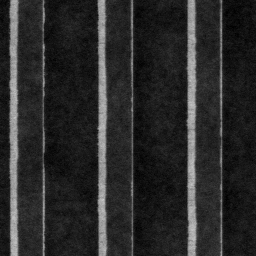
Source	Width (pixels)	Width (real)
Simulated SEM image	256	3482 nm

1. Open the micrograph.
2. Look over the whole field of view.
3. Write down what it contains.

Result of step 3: lines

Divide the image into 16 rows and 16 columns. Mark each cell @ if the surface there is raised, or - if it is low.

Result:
-@@---@@----@@--
-@@---@@----@@--
-@@---@@----@@--
-@@---@@----@@--
-@@---@@----@@--
-@@---@@----@@--
-@@---@@----@@--
-@@---@@----@@--
-@@---@@----@@--
-@@---@@----@@--
-@@---@@----@@--
-@@---@@----@@--
-@@---@@----@@--
-@@---@@----@@--
-@@---@@----@@--
-@@---@@----@@--